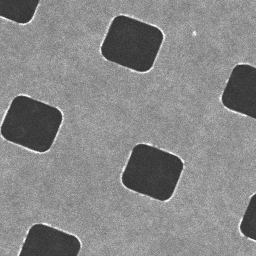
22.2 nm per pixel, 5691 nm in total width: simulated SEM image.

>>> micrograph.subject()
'holes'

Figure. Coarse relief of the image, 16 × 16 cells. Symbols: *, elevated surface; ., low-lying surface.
..**************
*******..*******
******....******
*******...******
***************.
**************..
*..***********..
....************
....************
********..******
********...*****
********...*****
****************
***************.
**..***********.
*....***********